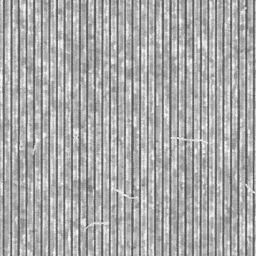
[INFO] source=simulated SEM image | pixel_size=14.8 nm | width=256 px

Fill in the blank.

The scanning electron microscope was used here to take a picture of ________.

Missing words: parallel lines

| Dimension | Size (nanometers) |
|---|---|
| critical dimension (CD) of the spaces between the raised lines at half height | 46.3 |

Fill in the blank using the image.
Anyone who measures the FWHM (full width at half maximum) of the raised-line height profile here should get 4.63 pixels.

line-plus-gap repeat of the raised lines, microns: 0.112